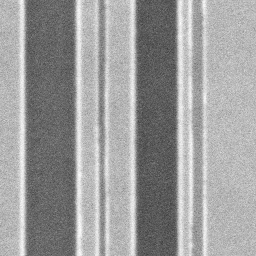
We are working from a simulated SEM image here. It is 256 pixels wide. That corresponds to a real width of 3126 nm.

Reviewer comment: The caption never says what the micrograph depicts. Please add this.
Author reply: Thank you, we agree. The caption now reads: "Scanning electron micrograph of lines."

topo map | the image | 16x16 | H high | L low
HLLLLHHHLLLHHHHH
HLLLLHHHLLLHHHHH
HLLLLHHHLLLHHHHH
HLLLLHHHLLLHHHHH
HLLLLHHHLLLHHHHH
HLLLLHHHLLLHHHHH
HLLLLHHHLLLHHHHH
HLLLLHHHLLLHHHHH
HLLLLHHHLLLHHHHH
HLLLLHHHLLLHHHHH
HLLLLHHHLLLHHHHH
HLLLLHHHLLLHHHHH
HLLLLHHHLLLHHHHH
HLLLLHHHLLLHHHHH
HLLLLHHHLLLHHHHH
HLLLLHHHLLLHHHHH